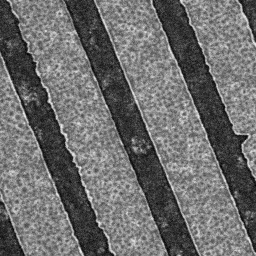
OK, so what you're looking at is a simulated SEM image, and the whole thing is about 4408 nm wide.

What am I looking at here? one or a few lines or trenches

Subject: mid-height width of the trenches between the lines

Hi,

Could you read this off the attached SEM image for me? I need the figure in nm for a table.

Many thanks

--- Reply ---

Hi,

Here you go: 498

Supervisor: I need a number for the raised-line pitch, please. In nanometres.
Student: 1360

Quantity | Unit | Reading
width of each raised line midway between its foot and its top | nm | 879